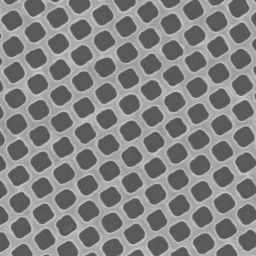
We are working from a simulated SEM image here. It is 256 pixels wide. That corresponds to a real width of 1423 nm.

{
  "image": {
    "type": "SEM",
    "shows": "a regular array of holes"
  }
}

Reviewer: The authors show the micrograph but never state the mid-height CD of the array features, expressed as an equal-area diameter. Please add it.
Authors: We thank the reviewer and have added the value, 110 nm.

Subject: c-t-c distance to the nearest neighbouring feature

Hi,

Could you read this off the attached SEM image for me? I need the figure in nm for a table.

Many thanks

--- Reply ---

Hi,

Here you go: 143